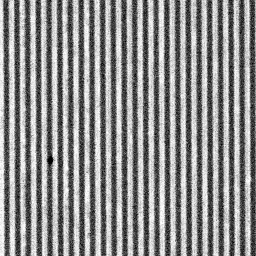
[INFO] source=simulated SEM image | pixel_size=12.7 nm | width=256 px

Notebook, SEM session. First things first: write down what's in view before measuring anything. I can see parallel lines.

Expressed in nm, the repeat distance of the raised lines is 136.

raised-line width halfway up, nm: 42.9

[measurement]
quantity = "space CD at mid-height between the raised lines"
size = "0.0985 µm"